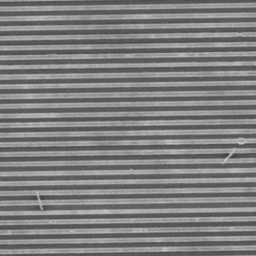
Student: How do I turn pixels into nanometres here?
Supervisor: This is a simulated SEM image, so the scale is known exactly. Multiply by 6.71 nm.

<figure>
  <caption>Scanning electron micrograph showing parallel lines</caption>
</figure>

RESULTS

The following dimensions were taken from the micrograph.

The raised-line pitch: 65.2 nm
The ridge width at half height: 30.2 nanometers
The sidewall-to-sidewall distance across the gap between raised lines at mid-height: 36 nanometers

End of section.